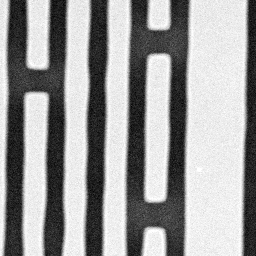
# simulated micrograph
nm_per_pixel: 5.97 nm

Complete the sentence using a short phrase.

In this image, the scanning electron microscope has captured groups of lines, slits or small figures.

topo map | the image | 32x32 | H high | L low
HLLHHHLLLHHLLLHHLLLHHLLLHHHHHHHL
HLLLHHLLHHHLLLHHLLLHHLLLHHHHHHHL
HLLLHHLLHHHLLLHHLLLHHLLLHHHHHHHL
HLLLHHLLHHHLLLHHLLLHHLLLHHHHHHHL
HLLLHHLLHHHLLLHHLLLLLLLLHHHHHHHL
HLLLHHLLHHHLLLHHLLLLLLLLHHHHHHHL
HLLHHHLLHHHLLLHHLLLLLLLLHHHHHHHL
HLLHHHLLHHHLLLHHLLLHHLLLHHHHHHHL
HLLLLLLLHHHLLHHHLLLHHLLLHHHHHHHL
HLLLLLLLHHHLLHHHLLHHHLLLHHHHHHHL
HLLLLLLLHHHLLHHHLLHHHLLLHHHHHHHL
HLLLLLLLHHHLLHHHLLHHHLLLHHHHHHHL
HLLHHHLLHHHLLHHHLLHHHLLLHHHHHHHL
HLLHHHLLHHHLLHHHLLHHHLLLHHHHHHHL
HLLHHHLLHHHLLHHHLLHHHLLLHHHHHHHL
HLLHHHLLHHHLLHHHLLHHHLLHHHHHHHHL
HLLHHHLLHHHLLHHHLLHHHLLHHHHHHHHL
HLLHHHLLHHHLLHHHLLHHHLLHHHHHHHLL
HLLHHHLLHHHLLHHHLLHHHLLHHHHHHHLL
HLLHHHLLHHHLLHHHLLHHHLLHHHHHHHLL
HLLHHHLLHHHLLHHHLLHHHLLHHHHHHHLL
HLLHHHLLHHHLLHHHLLHHHLLHHHHHHHLL
HLLHHHLLHHHLLHHHLLHHHLLHHHHHHHLL
HLLHHHLLHHHLLHHHLLHHHLLHHHHHHHLL
HLLHHHLLHHHLLHHHLLHHHLLHHHHHHHLL
HLLHHHLLHHHLLHHHLLLLLLLHHHHHHHLL
LLLHHLLLHHHLLHHHLLLLLLLHHHHHHHLL
LLLHHLLLHHHLLHHHLLLLLLLHHHHHHHLL
LLLHHLLLHHLLLHHHLLLLLLLHHHHHHHLL
LLLHHLLLHHLLLHHHLLHHHLLHHHHHHHLL
LLLHHLLLHHLLLHHHLLHHHLLHHHHHHHLL
LLLHHLLLHHHLLHHHLLHHHLLHHHHHHHLL